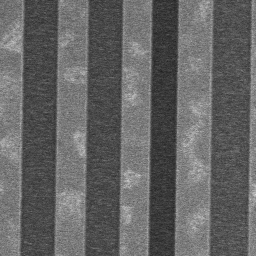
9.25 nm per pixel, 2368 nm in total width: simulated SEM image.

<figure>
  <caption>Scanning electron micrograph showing one or a few lines or trenches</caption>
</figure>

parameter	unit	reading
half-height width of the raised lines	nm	282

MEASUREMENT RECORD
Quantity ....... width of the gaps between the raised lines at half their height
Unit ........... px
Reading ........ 34.2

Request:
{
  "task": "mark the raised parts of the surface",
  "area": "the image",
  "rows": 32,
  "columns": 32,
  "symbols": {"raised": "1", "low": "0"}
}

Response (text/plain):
11100001111000011110001111100001
11100001111000011110001111100001
11100001111000011110001111100001
11100001111000011110001111100001
11100001111000011110001111100001
11100001111000011110001111000001
11100001111000011110001111100001
11100001111000011110001111000001
11100001111000011110001111000001
11100001111000011110001111000001
11100001111000011110001111000001
11100001111000011110001111000001
11100001111000011110001111000001
11100001111000011110001111000001
11100001111000011110001111000001
11100001111000011110001111000001
11100001111000011110001111000001
11100001111000011110001111000001
11100001111000011110001111000001
11100001111000011110001111000001
11100001111000011110001111000001
11100001111000011110001111000001
11100001111000011110001111000001
11100001111000011110001111000001
11100001111000011110001111000001
11100001111000011110001111000001
11100001111000011110001111000001
11100001111000011110001111000001
11100001111000011110001111000001
11100001111000011110001111000001
11000001111000011110001111000001
11000001111000011110001111000001